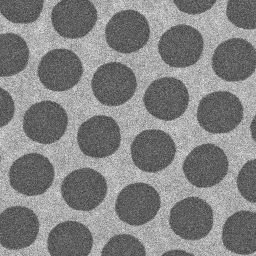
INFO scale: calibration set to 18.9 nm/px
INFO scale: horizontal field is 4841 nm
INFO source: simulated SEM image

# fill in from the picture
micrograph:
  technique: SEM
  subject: a regular array of holes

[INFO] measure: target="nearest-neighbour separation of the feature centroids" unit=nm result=1030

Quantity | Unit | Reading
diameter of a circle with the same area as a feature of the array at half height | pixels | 44.8